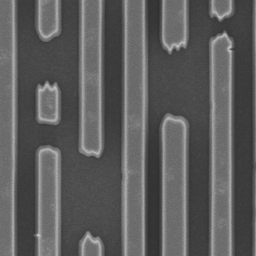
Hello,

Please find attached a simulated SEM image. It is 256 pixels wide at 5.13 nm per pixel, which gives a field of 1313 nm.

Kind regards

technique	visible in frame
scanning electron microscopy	parallel lines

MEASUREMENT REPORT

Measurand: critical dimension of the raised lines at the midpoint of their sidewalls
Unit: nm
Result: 112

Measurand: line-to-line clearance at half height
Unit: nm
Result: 112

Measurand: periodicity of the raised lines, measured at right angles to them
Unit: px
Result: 43.3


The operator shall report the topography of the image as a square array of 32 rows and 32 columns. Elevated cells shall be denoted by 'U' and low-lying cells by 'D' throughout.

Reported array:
UUDDDUUDDDUUUDDDUUDDUUUDDDUUUDDD
UUDDDUUDDDUUUDDDUUDDUUUDDDUUUDDD
UUDDDUUDDDUUUDDDUUDDUUUDDDDDDDDD
UUDDDUUDDDUUUDDDUUDDUUUDDDDDDDDD
UUDDDUUDDDUUUDDDUUDDUUUDDDDUDDDD
UUDDDDDDDDUUUDDDUUDDUUUDDDUUUDDD
UUDDDDDDDDUUUDDDUUDDDDDDDDUUUDDD
UUDDDDDDDDUUUDDDUUDDDDDDDDUUUDDD
UUDDDDDDDDUUUDDDUUDDDDDDDDUUUDDD
UUDDDDDDDDUUUDDDUUDDDDDDDDUUUDDD
UUDDDDDDDDUUUDDDUUDDDDDDDDUUUDDD
UUDDDUUDDDUUUDDDUUDDDDDDDDUUUDDD
UUDDDUUDDDUUUDDDUUDDDDDDDDUUUDDD
UUDDDUUDDDUUUDDDUUDDDDDDDDDUUDDD
UUDDDUUDDDUUUDDDUUDDDDDDDDDUUDDD
UUDDDDDDDDUUUDDDUUDDUUUDDDDUUDDD
UUDDDDDDDDUUUDDDUUDDUUUDDDDUUDDD
UUDDDDDDDDUUUDDDUUDDUUUDDDDUUDDD
UUDDDDDDDDUUUDDDUUDDUUUDDDUUUDDD
UUDDDUUDDDDDDDDDUUDDUUUDDDUUUDDD
UUDDDUUDDDDDDDDDUUDDUUUDDDUUUDDD
UUDDDUUDDDDDDDDDUUDDUUUDDDUUUDDD
UUDDDUUDDDDDDDDDUUDDUUUDDDUUUDDD
UUDDDUUDDDDDDDDDUUDDUUUDDDUUUDDD
UUDDDUUDDDDDDDDDUUDDUUUDDDUUUDDD
UUDDDUUDDDDDDDDDUUDDUUUDDDUUUDDD
UUDDDUUDDDDDDDDDUUDDUUUDDDUUUDDD
UUDDDUUDDDDDDDDDUUDDUUUDDDUUUDDD
UUDDDUUDDDDDDDDDUUDDUUUDDDUUUDDD
UUDDDUUDDDDDDDDDUUDDUUUDDDUUUDDD
UUDDDUUDDDUUUDDDUUDDUUUDDDUUUDDD
UUDDDUUDDDUUUDDDUUDDUUUDDDUUUDDD